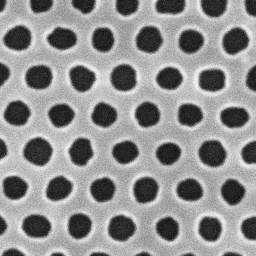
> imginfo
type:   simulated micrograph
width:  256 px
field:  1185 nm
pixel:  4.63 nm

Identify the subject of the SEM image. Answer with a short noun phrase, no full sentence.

a regular array of holes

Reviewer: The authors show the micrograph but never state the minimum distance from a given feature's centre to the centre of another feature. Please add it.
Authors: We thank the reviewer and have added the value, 42.3 pixels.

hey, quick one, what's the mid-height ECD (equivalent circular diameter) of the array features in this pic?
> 125 nm